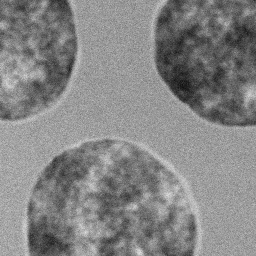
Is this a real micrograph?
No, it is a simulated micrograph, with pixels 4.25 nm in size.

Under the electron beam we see holes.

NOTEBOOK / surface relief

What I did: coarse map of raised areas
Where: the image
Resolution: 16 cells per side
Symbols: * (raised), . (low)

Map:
.....*****......
.....*****......
.....*****......
.....*****......
.....*****......
....*******.....
...*********....
..***********...
****************
****.....*******
***........*****
**.........*****
**..........****
**..........****
**..........****
**..........****